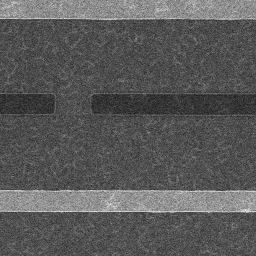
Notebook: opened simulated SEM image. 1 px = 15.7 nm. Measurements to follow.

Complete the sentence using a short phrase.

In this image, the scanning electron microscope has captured one or a few lines or trenches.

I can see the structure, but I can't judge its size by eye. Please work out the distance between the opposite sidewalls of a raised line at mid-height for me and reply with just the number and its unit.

327 nm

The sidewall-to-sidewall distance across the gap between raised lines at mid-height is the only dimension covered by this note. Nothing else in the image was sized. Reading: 1190 nm